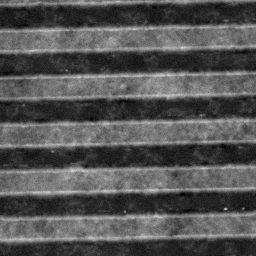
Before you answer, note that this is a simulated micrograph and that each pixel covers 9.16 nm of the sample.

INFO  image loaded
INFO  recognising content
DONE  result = parallel lines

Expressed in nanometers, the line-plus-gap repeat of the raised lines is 432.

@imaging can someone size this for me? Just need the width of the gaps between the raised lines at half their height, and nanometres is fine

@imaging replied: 229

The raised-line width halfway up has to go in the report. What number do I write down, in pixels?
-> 22.2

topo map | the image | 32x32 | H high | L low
HHHHHLLLLHHLLLLLLLLLLLLLLLLLLLLL
LLLLLLLLLLLLLLLLLLLLLLLLLLLLLLLL
LLLLLLLLLLLLLLLLLLLLLLLLLLLLLLLL
LLLLLLLLLLLLLLLLLHHHHHHHHHHHHHHH
HHHHHHHHHHHHHHHHHHHHHHHHHHHHHHHH
HHHHHHHHHHHHHHHHHHHHHHHHHHHHHHHH
HLLLLLLLLLLLLLLLLLLLLLLLLLLLLLLL
LLLLLLLLLLLLLLLLLLLLLLLLLLLLLLLL
LLLLLLLLLLLLLLLLLLLLLLLLLLLLLLLL
LLLLLLLLLLLLHHHHHHHHHHHHHHHHHHHH
HHHHHHHHHHHHHHHHHHHHHHHHHHHHHHHH
HHHHHHHHHHHHHHHHHHHHHHHHHHHHHHHH
LLLLLLLLLLLLLLLLLLLLLLLLLLLLLLLL
LLLLLLLLLLLLLLLLLLLLLLLLLLLLLLLL
LLLLLLLLLLLLLLLLLLLLLLLLLLLLLLLL
LLLLLLLLHHHHHHHHHHHHHHHHHHHHHHHH
HHHHHHHHHHHHHHHHHHHHHHHHHHHHHHHH
HHHHHHHHHHHHHHHHHHHHHHHHHHHHHHHH
LLLLLLLLLLLLLLLLLLLLLLLLLLLLLLLL
LLLLLLLLLLLLLLLLLLLLLLLLLLLLLLLL
LLLLLLLLLLLLLLLLLLLLLLLLLLLLLLLL
HHHHHHHHHHHHHHHHHHHHHHHHHHHHHHHH
HHHHHHHHHHHHHHHHHHHHHHHHHHHHHHHH
HHHHHHHHHHHHHHHHHHHHHHHHHHHHHHHH
LLLLLLLLLLLLLLLLLLLLLLLLLLLLLLLL
LLLLLLLLLLLLLLLLLLLLLLLLLLLLLLLL
LLLLLLLLLLLLLLLLLLLLLLLLLLLLLLLL
HHHHHHHHHHHHHHHHHHHHHHHHHHHHHHHH
HHHHHHHHHHHHHHHHHHHHHHHHHHHHHHHH
HHHHHHHHHHHHHHHHHHHHHHHHHHHLLHLH
LLLLLLLLLLLLLLLLLLLLLLLLLLLLLLLL
LLLLLLLLLLLLLLLLLLLLLLLLLLLLLLLL